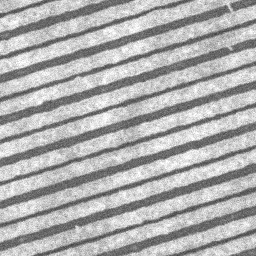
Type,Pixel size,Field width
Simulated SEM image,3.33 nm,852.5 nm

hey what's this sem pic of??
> parallel lines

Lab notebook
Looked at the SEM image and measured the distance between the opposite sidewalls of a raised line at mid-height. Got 41.4 nanometres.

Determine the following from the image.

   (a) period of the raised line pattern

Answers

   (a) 66.9 nanometers